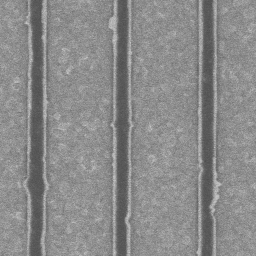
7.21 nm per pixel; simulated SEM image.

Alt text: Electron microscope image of one or a few lines or trenches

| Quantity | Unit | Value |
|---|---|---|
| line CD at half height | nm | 114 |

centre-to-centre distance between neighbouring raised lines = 0.616 um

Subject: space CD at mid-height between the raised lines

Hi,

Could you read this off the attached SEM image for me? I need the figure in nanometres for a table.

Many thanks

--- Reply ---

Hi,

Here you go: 498